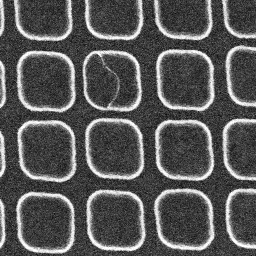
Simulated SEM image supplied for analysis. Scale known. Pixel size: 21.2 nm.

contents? a regular array of raised bodies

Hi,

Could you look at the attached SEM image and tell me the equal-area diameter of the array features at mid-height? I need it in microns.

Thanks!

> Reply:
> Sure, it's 1.26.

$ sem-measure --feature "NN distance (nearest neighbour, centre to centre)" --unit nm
1460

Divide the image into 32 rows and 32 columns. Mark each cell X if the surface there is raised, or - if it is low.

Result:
--XXXXXXX--XXXXXX---XXXXXX--XXXX
--XXXXXXX--XXXXXXX--XXXXXX--XXXX
--XXXXXXX--XXXXXXX--XXXXXX--XXXX
--XXXXXXX--XXXXXX---XXXXXX---XXX
---XXXXX-----XXXX----XXXX-----XX
--------------------------------
------------------------X----XXX
---XXXXX---XXXXXX---XXXXXX--XXXX
--XXXXXXX--XXXXXX---XXXXXX--XXXX
--XXXXXXX--XXXXXX---XXXXXX---XXX
--XXXXXXX--XXXXXX---XXXXXX---XXX
--XXXXXXX--XXXXXXX--XXXXXX---XXX
---XXXXXX--XXXXXX---XXXXXX---XXX
----XXXX-----XXX-------XX-------
--------------------------------
---XXXXX----XXXX----XXXXX----XXX
---XXXXXX--XXXXXX---XXXXXX--XXXX
--XXXXXXX--XXXXXXX--XXXXXX--XXXX
---XXXXXX--XXXXXXX--XXXXXX--XXXX
---XXXXXX--XXXXXXX--XXXXXX--XXXX
---XXXXXX--XXXXXXX--XXXXXX--XXXX
---XXXXXX---XXXXX---XXXXXX---XXX
-------X------------------------
--------------------------------
---XXXX-----XXXXX---XXXXX----XXX
--XXXXXXX--XXXXXXX--XXXXXX---XXX
--XXXXXXX--XXXXXXX--XXXXXX--XXXX
--XXXXXXX--XXXXXXX--XXXXXX--XXXX
--XXXXXXX--XXXXXXX--XXXXXX---XXX
---XXXXXX--XXXXXXX--XXXXXX---XXX
---XXXXXX---XXXXX----XXXXX----XX
--------------------------------